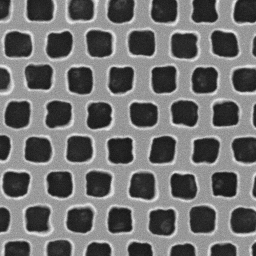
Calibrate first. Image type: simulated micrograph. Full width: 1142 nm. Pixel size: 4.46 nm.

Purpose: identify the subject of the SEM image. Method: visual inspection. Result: a regular array of holes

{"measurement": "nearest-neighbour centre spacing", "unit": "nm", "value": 177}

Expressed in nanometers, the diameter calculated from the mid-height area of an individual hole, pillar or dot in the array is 126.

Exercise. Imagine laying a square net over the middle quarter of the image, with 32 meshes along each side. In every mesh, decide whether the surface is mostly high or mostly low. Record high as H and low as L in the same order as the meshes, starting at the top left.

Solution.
HHHHHHHHHHHHHHHHHHHHHHHHHLLHHHHH
HLLLLLLHHHHHLLLLLHHHHHLLLLLLHHHH
HLLLLLLHHHHLLLLLLLHHHHLLLLLLHHHH
HLLLLLLHHHHLLLLLLHHHHHLLLLLLHHHH
HLLLLLLHHHHLLLLLLHHHHHLLLLLLHHHH
HLLLLLLHHHHLLLLLLHHHHHLLLLLLHHHH
HLLLLLLHHHHLLLLLLHHHHHLLLLLLHHHH
HHHLLLHHHHHHHLLHHHHHHHHLHHHHHHHH
HHHHHHHHHHHHHHHHHHHHHHHHHHHHHHHH
LHHHHHHLHHHHHHHHHHHHHHHHHHHLLLLL
LLHHHHLLLLLLHHHHLLLLLLLHHHHLLLLL
LLHHHHLLLLLLHHHHLLLLLLLLHHHLLLLL
LLHHHHLLLLLLHHHHLLLLLLLLHHHLLLLL
LLHHHHLLLLLLHHHHLLLLLLLLHHHLLLLL
LHHHHHLLLLLLHHHHHLLLLLLHHHHLLLLL
LHHHHHLLLLHHHHHHHHLLLLHHHHHHHHHL
HHHHHHHHHHHHHHHHHHHHHHHHHHHHHHHH
HHHHHHHHHHHHHHHHHHHHHHHHHHHHHHHH
HLLLLLLHHHHHLLLLLHHHHHHLLLLHHHHH
HLLLLLLHHHHLLLLLLHHHHHLLLLLLHHHH
HLLLLLLHHHHLLLLLLHHHHHLLLLLLHHHH
HLLLLLLHHHHLLLLLLHHHHHLLLLLLHHHH
HLLLLLLHHHHLLLLLLHHHHLLLLLLLHHHH
HLLLLLLHHHHLLLLLLHHHHLLLLLLLHHHH
HHLLLLHHHHHHLLLLLHHHHHLLLLLHHHHH
HHHHHHHHHHHHHHHHHHHHHHHHHHHHHHHH
HHHHHHHLHHHHHHHHHHHHHHHHHHHHHHHH
LLHHHHLLLLLLHHHHHLLLLLHHHHHLLHHH
LLHHHLLLLLLLHHHHHLLLLLLHHHHLLLLL
LLHHHLLLLLLLHHHHLLLLLLLHHHHLLLLL
LLHHHLLLLLLLHHHHLLLLLLLHHHHLLLLL
LLHHHLLLLLLLHHHHLLLLLLLHHHHLLLLL